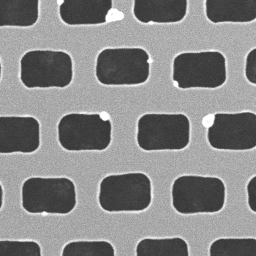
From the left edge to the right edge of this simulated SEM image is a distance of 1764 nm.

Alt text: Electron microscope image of a regular array of holes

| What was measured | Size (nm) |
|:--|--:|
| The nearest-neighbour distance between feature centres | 496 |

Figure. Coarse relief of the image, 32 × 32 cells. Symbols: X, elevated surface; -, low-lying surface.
-----XXX------XXX------XXX------
-----XX-------XXX------XXX------
-----XXX-----XXXX------XXX------
XXXXXXXXXXXXXXXXXXXXXXXXXXXXXXXX
XXXXXXXXXXXXXXXXXXXXXXXXXXXXXXXX
XXXXXXXXXXXXXXXXXXXXXXXXXXXXXXXX
XXXX----XXXXX-----XXXXXXX--XXXX-
XXX------XXX-------XXX------XXX-
XXX------XXX-------XXX------XXX-
XXX------XXX-------XXX------XXX-
XXX------XXXX----XXXXX------XXXX
XXXXXXXXXXXXXXXXXXXXXXXXXXXXXXXX
XXXXXXXXXXXXXXXXXXXXXXXXXXXXXXXX
XXXXXXXXXXXXXXXXXXXXXXXXXXXXXXXX
XXXXXXXX----XXXXXX-----XXXX-----
-----XX-------XXX-------XXX-----
-----XX-------XXX-------XX------
-----XX-------XXX-------XX------
-----XXX-----XXXXX-----XXXX-----
XXXXXXXXXXXXXXXXXXXXXXXXXXXXXXXX
XXXXXXXXXXXXXXXXXXXXXXXXXXXXXXXX
XXXXXXXXXXXXXXXXXXXXXXXXXXXXXXXX
XXX------XXXX------XXX-----XXXX-
XXX------XXX-------XXX------XXX-
XXX-------XX-------XX-------XXX-
XXX------XXX-------XXX------XXX-
XXXX-----XXXXXXXXXXXXX-----XXXXX
XXXXXXXXXXXXXXXXXXXXXXXXXXXXXXXX
XXXXXXXXXXXXXXXXXXXXXXXXXXXXXXXX
XXXXXXXXXXXXXXXXXXXXXXXXXXXXXXXX
-----XXX------XXX------XXX------
-----XXX------XXX-------XX------